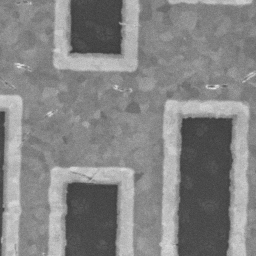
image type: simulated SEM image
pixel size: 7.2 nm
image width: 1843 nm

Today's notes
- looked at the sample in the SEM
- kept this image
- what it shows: one or a few lines or trenches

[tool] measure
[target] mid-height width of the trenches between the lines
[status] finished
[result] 513 nanometers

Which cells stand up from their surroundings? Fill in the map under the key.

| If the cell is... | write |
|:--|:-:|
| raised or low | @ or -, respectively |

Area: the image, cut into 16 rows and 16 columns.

@@@@----@@@@@@@@
@@@@----@@@@@@@@
@@@@----@@@@@@@@
@@@@----@@@@@@@@
@@@@@@@@@@@@@@@@
@@@@@@@@@@@@@@@@
-@@@@@@@@@@@@@@@
-@@@@@@@@@@----@
-@@@@@@@@@@----@
-@@@@@@@@@@----@
-@@@@@@@@@@----@
-@@@----@@@----@
-@@-----@@@----@
-@@-----@@@----@
-@@-----@@@----@
-@@-----@@-----@